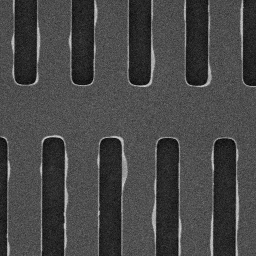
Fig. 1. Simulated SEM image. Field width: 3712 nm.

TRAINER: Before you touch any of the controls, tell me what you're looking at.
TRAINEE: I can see groups of lines, slits or small figures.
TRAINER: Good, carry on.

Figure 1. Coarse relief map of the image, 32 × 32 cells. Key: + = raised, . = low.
++...++++...++++...++++...++++..
++...++++...++++...++++...++++..
++...++++...++++...++++...++++..
++...++++...++++...++++...++++..
++...++++...++++...++++...++++..
++...++++...++++...++++...++++..
++...++++...++++...++++...++++..
++...++++...++++...++++...++++..
++...++++...++++...++++...++++..
++...++++...++++...++++...++++..
++..+++++..++++++..+++++..+++++.
++++++++++++++++++++++++++++++++
++++++++++++++++++++++++++++++++
++++++++++++++++++++++++++++++++
++++++++++++++++++++++++++++++++
++++++++++++++++++++++++++++++++
++++++++++++++++++++++++++++++++
.+++++..+++++..+++++..+++++..+++
.++++...++++...+++++..+++++...++
.++++...++++...++++...+++++...++
.++++...++++....+++...+++++...++
.++++...++++....+++...+++++...++
.++++...++++...++++...+++++...++
.++++...++++...++++...+++++...++
.++++...++++...++++...+++++...++
.++++...++++...++++...+++++...++
.++++...++++...++++...+++++...++
.++++...++++...++++...+++++...++
.++++...++++...++++....+++....++
.++++...++++...++++...++++....++
.++++...++++...++++...++++....++
.++++...++++...++++...+++++...++